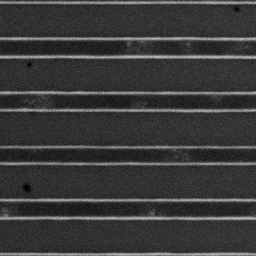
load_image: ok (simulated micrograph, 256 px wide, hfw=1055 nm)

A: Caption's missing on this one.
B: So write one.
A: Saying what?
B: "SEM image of parallel lines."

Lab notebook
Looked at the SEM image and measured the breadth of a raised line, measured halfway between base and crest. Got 77.3 nm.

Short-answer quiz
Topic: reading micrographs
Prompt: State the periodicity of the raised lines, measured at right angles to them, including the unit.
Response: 222 nm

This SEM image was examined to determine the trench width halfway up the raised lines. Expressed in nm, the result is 144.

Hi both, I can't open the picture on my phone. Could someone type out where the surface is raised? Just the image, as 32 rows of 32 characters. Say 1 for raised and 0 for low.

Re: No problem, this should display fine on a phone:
00000000000000000000000000000000
00000000000000000000000000000000
00000000000000000000000000000000
00000000000000000000000000000000
00000000000000000000000000000000
11111111111111111111111111111111
11111111111111111111111111111111
00000000000000000000000000000000
00000000000000000000000000000000
00000000000000000000000000000000
00000000000000000000000000000000
00000000000000000000000000000000
11111111111111111111111111111111
11111111111111111111111111111111
00000000000000000000000000000000
00000000000000000000000000000000
00000000000000000000000000000000
00000000000000000000000000000000
11111111111111111111111111111111
11111111111111111111111111111111
00000000000000001111111111111111
00000000000000000000000000000000
00000000000000000000000000000000
00000000000000000000000000000000
00000000000000000000000000000000
11111111111111111111111111111111
11111111111111111111111111111111
00000000000000000000000000000000
00000000000000000000000000000000
00000000000000000000000000000000
00000000000000000000000000000000
00000000000000000000000000000000